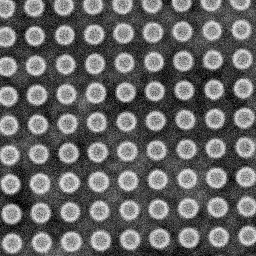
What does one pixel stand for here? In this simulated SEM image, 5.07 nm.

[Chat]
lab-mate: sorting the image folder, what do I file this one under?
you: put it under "an array of small figures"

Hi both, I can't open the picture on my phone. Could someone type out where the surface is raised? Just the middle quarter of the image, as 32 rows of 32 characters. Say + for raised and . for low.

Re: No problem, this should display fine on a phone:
++....++++...++++....+++....++++
++....+++.....++......+.........
................................
................................
................................
+......++.....+++....+++....++++
++....++++...++++....++++...++++
+++...++++...++++....++++...++++
+++...++++....+++....+++.....++.
+...............................
................................
................................
........+......++.....++.....+++
++....++++....++++...++++...++++
+++...++++....++++...++++...++++
+++...++++....++++...++++....+++
++.....++......+................
................................
................................
.......................+......++
++.....+++....+++....++++....+++
+++...+++++...++++...++++....+++
+++...+++++...++++...++++....+++
+++....+++....+++.....++......+.
................................
................................
................................
.+.....+++.....++.....+++....+++
+++....++++...++++...+++++...+++
++++...++++...++++...++++....+++
+++....++++...++++....+++.....++
+++.....+.......................